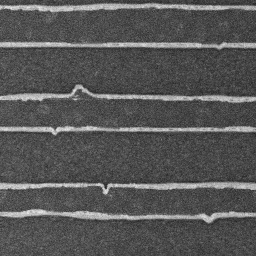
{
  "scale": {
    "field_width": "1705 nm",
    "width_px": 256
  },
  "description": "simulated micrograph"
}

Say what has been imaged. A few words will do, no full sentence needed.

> one or a few lines or trenches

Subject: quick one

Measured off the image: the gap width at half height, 348 nanometers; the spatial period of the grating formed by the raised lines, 581 nm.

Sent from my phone